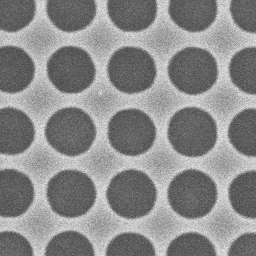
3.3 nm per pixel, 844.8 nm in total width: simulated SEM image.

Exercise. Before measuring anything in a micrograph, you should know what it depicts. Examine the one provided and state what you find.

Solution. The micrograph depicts a regular array of holes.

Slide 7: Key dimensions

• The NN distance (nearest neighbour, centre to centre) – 60.8 pixels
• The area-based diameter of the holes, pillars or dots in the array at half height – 163 nm